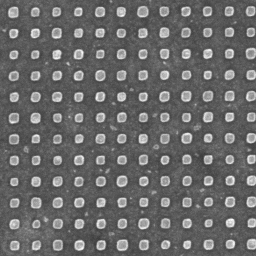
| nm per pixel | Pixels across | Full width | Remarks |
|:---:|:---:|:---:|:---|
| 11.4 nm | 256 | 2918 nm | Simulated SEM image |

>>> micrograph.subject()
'a regular array of raised bodies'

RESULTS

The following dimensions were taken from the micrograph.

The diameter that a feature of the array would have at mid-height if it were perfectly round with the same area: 9.44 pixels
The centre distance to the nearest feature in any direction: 240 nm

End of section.